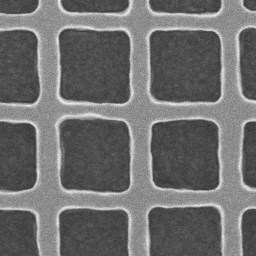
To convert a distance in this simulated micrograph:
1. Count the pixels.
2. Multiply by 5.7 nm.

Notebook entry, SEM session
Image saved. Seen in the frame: holes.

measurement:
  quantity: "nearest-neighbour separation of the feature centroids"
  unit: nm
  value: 506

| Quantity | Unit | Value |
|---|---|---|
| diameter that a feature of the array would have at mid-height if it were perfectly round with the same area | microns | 0.459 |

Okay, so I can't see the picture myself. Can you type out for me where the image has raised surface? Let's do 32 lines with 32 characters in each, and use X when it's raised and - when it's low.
-----XXX--------XXX---------XX--
----XXXXX-------XXX--------XXXXX
XXXXXXXXXXXXXXXXXXXXXXXXXXXXXXXX
XXXXXXXXX-XXXXXXXXXXXXXXXXXXXXX-
-----XX---------XXX--------XXX--
-----XX---------XXX---------XX--
-----XX---------XXX---------XX--
-----XX---------XXX---------XX--
-----XXX--------XXX---------XX--
-----XXX--------XXX---------XX--
-----XX---------XXX---------XX--
-----XX---------XXX---------XX--
-----XXX--------XXX--------XXXX-
XXXXXXXXXXXXXXXXXXXXXXXXXXXXXXXX
XXXXXXXXXXXXXXXXXXXXXXXXXXXXXXXX
----XXX---------XXX--------XXXX-
-----XX---------XXX--------XXX--
-----XX---------XXX--------XXX--
-----XXX--------XXX--------XXX--
-----XXX--------XXX--------XXX--
-----XXX--------XXX--------XXX--
-----XX---------XXX--------XXX--
-----XXX--------XXX--------XXX--
----XXXX--------XXXX-------XXXX-
XXXXXXXXXXXXXXXXXXXXXXXXXXXXXXXX
XXXXXXXXXXXXXXXXXXXXXXXXXXXXXXXX
----XXXX--------XXX--------XXXX-
-----XX---------XXX---------XX--
-----XX---------XXX---------XX--
-----XX---------XXX---------XX--
-----XX---------XXX---------XX--
-----XX---------XXX---------XX--